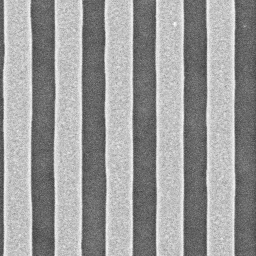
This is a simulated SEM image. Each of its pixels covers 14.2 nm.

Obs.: wiring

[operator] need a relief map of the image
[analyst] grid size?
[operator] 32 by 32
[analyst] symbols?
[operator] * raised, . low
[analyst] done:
.***...***...***....***...***...
.***...***...***....***...***...
.***...***...***....***...***...
.***...***...***....***...***...
.***...***...***....***...***...
.***...***...***....***...***...
.***...***...***....***...***...
.***...***...***....***...***...
****...***...***....***...***...
****...***...***....***...***...
****...***...***....***...***...
****...***...***....***...***...
****...***...***....***...***...
.***...***...***....***...***...
.***...***...***....***...***...
****...***...***....***...***...
****...***...***....***...***...
.***...***...***....***...***...
.***...***...***....***...***...
.***...***...***....***...***...
.***...***...***....***...***...
.***...***...***....***...***...
.***...***...***....***...***...
.***...***...***....***...***...
.***...***...***....***...***...
.***...***...***....***...***...
.***...***...***....***...***...
.***...***...***....***...***...
.***...***...***....***...***...
.***...***...***....***...***...
.***...***...***....***...***...
****...***...***....***...***...